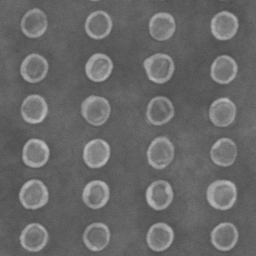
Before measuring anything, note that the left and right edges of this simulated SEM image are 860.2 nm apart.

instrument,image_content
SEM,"a regular array of raised bodies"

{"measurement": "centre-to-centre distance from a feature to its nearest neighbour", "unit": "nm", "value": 141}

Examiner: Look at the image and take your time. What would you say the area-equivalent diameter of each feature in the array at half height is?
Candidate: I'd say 90.7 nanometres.